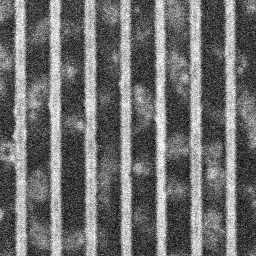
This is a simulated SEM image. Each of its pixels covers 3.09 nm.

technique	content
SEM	parallel lines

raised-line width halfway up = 24.7 nm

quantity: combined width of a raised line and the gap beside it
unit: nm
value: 108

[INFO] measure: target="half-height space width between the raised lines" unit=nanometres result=83.5